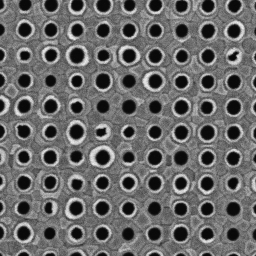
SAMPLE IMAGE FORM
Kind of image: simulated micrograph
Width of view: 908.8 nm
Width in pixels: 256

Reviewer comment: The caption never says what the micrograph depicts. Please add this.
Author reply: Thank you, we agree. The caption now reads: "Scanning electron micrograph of a regular array of holes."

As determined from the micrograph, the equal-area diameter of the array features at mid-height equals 0.042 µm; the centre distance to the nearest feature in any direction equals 89.4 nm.